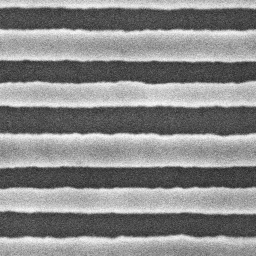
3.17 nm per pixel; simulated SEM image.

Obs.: lines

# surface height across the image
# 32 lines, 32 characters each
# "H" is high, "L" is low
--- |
HHHHHHHHHHHHHHHHHHHHHHHHHHHHHHHH
LLLLLLLLLLLLLLLLLLLLLLLLLLLLLLLL
LLLLLLLLLLLLLLLLLLLLLLLLLLLLLLLL
LLLLLLLLLLLLLLLLLLLLLLLLLLLLLLLL
HHHHHHHHHHHHHHHHHHHHHHHHHHHHHHHH
HHHHHHHHHHHHHHHHHHHHHHHHHHHHHHHH
HHHHHHHHHHHHHHHHHHHHHHHHHHHHHHHH
LLLLLLHLLHHHLHLHHHHHHHHHHHHHHHHH
LLLLLLLLLLLLLLLLLLLLLLLLLLLLLLLL
LLLLLLLLLLLLLLLLLLLLLLLLLLLLLLLL
HHHHHHHHHHHHHHHHHHLLHHHHHHHHHHHH
HHHHHHHHHHHHHHHHHHHHHHHHHHHHHHHH
HHHHHHHHHHHHHHHHHHHHHHHHHHHHHHHH
LLLLLLLLLLLLLLLLLLLLLLLLLLLLLLLL
LLLLLLLLLLLLLLLLLLLLLLLLLLLLLLLL
LLLLLLLLLLLLLLLLLLLLLLLLLLLLLLLL
LLLLLLLLLLLLLLLLLLLLLLLLLLLLLLLL
HHHHHHHHHHHHHHHHHHHHHHHHHHHHHHHH
HHHHHHHHHHHHHHHHHHHHHHHHHHHHHHHH
HHHHHHHHHHHHHHHHHHHHHHHHHHHHHHHH
HHHHHHHHHHHHHHHHHHHHHHHHHHHHHHHH
LLLLLLLLLLLLLLLLLLLLLLLLLLLLLLLL
LLLLLLLLLLLLLLLLLLLLLLLLLLLLLLLL
LLLLLLLLHLLLLLLLLLLLLLLLHLHHLLLH
HHHHHHHHHHHHHHHHHHHHHHHHHHHHHHHH
HHHHHHHHHHHHHHHHHHHHHHHHHHHHHHHH
LLLHLHHHHHHHHHHHHHHHHHHHHHHHHHHH
LLLLLLLLLLLLLLLLLLLLLLLLLLLLLLLL
LLLLLLLLLLLLLLLLLLLLLLLLLLLLLLLL
LLLLLLLLLLLLLLLLLLLLLLHLLLLLLLLL
HHHHHHHHHHHHHHHHHHHHHHHHHHHHHHHH
HHHHHHHHHHHHHHHHHHHHHHHHHHHHHHHH